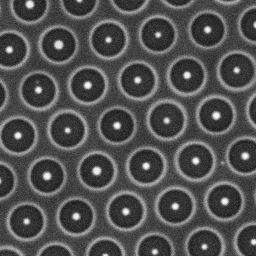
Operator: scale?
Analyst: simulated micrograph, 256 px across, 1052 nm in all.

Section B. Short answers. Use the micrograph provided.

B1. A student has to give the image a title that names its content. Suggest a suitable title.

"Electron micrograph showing an array of small figures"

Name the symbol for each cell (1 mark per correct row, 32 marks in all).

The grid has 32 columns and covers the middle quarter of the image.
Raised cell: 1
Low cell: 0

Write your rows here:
11111111111111110000011111100000
11110000111111100000001111000000
11000000011111000000000111000010
11000000001111000000000111000000
11000000001111000000000111100000
11000110001111000000000111100000
11000000001111100000001111110000
11000000001111110000001111111111
11100000011111111101111111111111
11110001111111111111111110111111
11111111111111111111111000001111
11111111111100011111110000000111
00011111110000001111100000000011
00001111100000000111100000000011
00000111100000000011100000000011
00000111100001000011110000000011
00000111100000000111110000000111
00000111100000000111111000000111
00000111110000001111111110011111
00001111111100111111111111111111
00011111111111111111111111111100
11111111111111111110001111111000
11111110011111111000000011111000
11111000000111111000000001110000
11110000000011110000000001110000
11110000000011110000100001111000
11110001100001110000000001111000
11110000000001110000000001111100
11110000000011111000000011111110
11111000000011111100000111111111
11111100000111111111111111111111
11111111111111111111111111000111